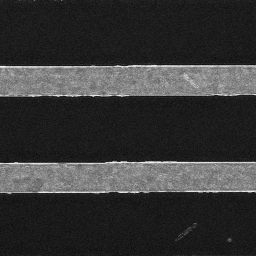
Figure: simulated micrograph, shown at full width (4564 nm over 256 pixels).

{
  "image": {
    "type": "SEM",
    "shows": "lines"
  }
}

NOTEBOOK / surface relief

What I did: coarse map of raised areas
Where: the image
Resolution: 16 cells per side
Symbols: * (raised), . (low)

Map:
................
................
................
................
****************
****************
................
................
................
................
****************
****************
................
................
................
................